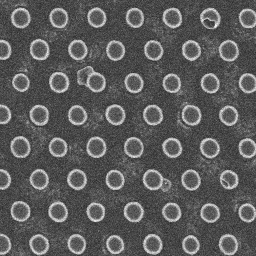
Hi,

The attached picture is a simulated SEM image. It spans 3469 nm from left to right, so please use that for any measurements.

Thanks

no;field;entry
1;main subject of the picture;a regular array of raised bodies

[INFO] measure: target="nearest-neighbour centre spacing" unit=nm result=505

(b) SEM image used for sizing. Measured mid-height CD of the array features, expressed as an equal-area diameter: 252 nm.